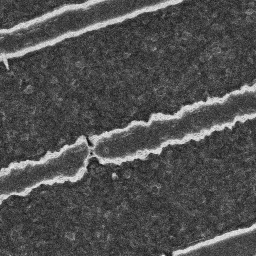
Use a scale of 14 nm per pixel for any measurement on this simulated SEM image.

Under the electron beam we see one or a few lines or trenches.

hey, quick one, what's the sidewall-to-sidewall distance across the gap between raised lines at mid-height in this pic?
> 1470 nanometres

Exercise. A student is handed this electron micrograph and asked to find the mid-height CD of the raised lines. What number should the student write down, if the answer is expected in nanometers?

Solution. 389